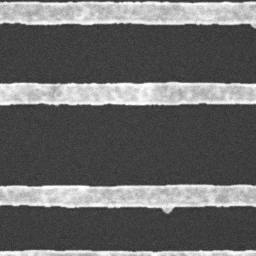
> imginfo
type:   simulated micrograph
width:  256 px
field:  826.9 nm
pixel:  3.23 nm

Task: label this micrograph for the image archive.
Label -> lines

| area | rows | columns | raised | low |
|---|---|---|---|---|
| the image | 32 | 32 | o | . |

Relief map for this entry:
oooooooooooooooooooooooooooooooo
oooooooooooooooooooooooooooooooo
oooooooooooooooooooooooooooooooo
................................
................................
................................
................................
................................
................................
................................
.oooo..ooo.o...oo.oooooooooo.o..
oooooooooooooooooooooooooooooooo
oooooooooooooooooooooooooooooooo
................................
................................
................................
................................
................................
................................
................................
................................
................................
................................
oooooooooooooooooooooooooooooooo
oooooooooooooooooooooooooooooooo
oooooooooooooooooooooooooooooooo
................................
................................
................................
................................
................................
...oooo...o...............ooo..o